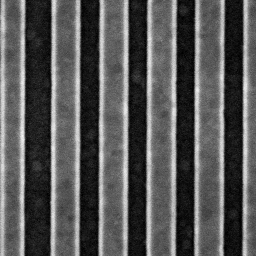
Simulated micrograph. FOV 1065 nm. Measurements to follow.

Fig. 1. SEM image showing parallel lines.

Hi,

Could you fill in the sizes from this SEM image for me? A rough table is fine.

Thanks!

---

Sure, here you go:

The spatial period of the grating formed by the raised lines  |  205 nanometers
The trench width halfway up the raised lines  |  0.0953 microns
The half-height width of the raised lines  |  106 nm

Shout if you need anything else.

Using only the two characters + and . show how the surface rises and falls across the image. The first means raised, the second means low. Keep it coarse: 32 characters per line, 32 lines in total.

+++....+++...+++...+++...+++...+
+++....+++...+++...+++...+++...+
+++....+++...+++...+++...+++...+
+++....+++...+++...+++...+++...+
+++....+++...+++...+++...+++...+
+++....+++...+++...+++...+++...+
+++....+++...+++...+++...+++...+
+++....+++...+++...+++...+++...+
+++....+++...+++...+++...+++...+
+++....+++...+++...+++...+++...+
+++....+++...+++...+++...+++...+
+++....+++...+++...+++...+++...+
+++....+++...+++...+++...+++...+
+++....+++...+++...+++...+++...+
+++....+++...+++...+++...+++...+
+++....+++...+++...+++...+++...+
+++....+++...+++...+++...+++...+
+++....+++...+++...+++...+++...+
+++....+++...+++...+++...+++...+
+++....+++...+++...+++...+++...+
+++....+++...+++...+++...+++...+
+++....+++...+++...+++...+++...+
+++....+++...+++...+++...+++...+
+++....+++...+++...+++...+++...+
+++....+++...+++...+++...+++...+
+++....+++...+++...+++...+++...+
+++....+++...+++...+++...+++...+
+++....+++...+++...+++...+++...+
+++....+++...+++...+++...+++...+
+++....+++...+++...+++...+++...+
+++....+++...+++...+++..++++...+
+++....+++...+++...+++..++++...+